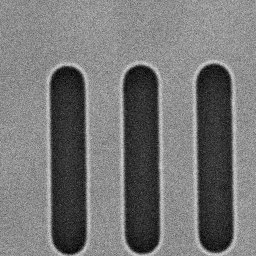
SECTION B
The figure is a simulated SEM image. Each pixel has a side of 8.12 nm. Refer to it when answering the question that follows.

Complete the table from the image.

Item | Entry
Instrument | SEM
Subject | groups of lines, slits or small figures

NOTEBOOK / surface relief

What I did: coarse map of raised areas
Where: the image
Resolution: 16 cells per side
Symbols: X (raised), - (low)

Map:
XXXXXXXXXXXXXXXX
XXXXXXXXXXXXXXXX
XXXXXXXXXXXXXXXX
XXXXXXXXXXXXXXXX
XXX--XXX--XX--XX
XXX--XXX--XX---X
XXX--XXX--XX---X
XXX--XXX--XX---X
XXX--XXX--XX---X
XXX--XXX--XX---X
XXX---XX--XX---X
XXX---XX--XX---X
XXX---XX--XX---X
XXX---XX--XX---X
XXX---XX--XX---X
XXX--XXX--XXX-XX